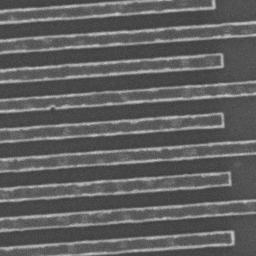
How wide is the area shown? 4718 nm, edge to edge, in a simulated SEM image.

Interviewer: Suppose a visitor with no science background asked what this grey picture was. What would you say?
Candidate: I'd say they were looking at parallel lines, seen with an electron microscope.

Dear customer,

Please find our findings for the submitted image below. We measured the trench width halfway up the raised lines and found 299 nanometres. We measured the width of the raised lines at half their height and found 0.246 microns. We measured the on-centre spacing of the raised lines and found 29.6 pixels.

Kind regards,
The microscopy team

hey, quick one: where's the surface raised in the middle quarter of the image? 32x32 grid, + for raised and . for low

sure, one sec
++++++++++++++++++++++++++++++++
++++++++++++++++++++++++++++....
++++++++++++++..................
................................
................................
................................
.....................+++++++++++
......++++++++++++++++++++++++++
++++++++++++++++++++++++++++++++
++++++++++++++++++++............
++++++..........................
................................
................................
.......................+++++++++
.............+++++++++++++++++++
++++++++++++++++++++++++++++++++
++++++++++++++++++++++++++......
+++++++++++++...................
................................
................................
................................
..................++++++++++++++
.+..++++++++++++++++++++++++++++
++++++++++++++++++++++++++++++++
++++++++++++++++++++............
+++.............................
................................
................................
.....................+..++++++++
........++++++++++++++++++++++++
++++++++++++++++++++++++++++++++
++++++++++++++++++++++++++......